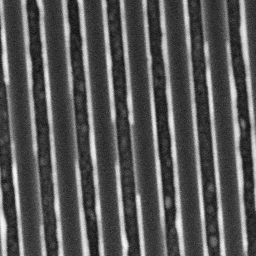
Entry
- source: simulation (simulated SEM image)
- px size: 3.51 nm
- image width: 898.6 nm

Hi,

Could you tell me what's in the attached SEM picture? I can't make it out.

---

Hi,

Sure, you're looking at parallel lines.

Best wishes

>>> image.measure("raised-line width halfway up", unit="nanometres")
95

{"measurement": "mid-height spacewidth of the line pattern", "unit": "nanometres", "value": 44.6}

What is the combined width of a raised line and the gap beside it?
141 nanometers